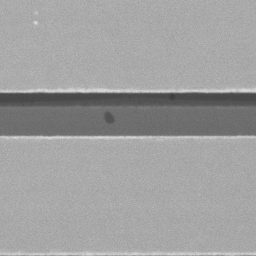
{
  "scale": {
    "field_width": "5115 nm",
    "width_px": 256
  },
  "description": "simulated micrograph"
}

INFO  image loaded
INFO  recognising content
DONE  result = lines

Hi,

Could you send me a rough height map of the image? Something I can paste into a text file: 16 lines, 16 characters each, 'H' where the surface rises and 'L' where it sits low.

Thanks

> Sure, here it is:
HHHHHHHHHHHHHHHH
HHHHHHHHHHHHHHHH
HHHHHHHHHHHHHHHH
HHHHHHHHHHHHHHHH
HHHHHHHHHHHHHHHH
HHHHHHHHHHHHHHHH
LLLLLLLLLLLLLLLL
LLLLLLLLLLLLLLLL
LLLLLLLLLLLLLLLH
HHHHHHHHHHHHHHHH
HHHHHHHHHHHHHHHH
HHHHHHHHHHHHHHHH
HHHHHHHHHHHHHHHH
HHHHHHHHHHHHHHHH
HHHHHHHHHHHHHHHH
HHHHHHHHHHHHHHHH